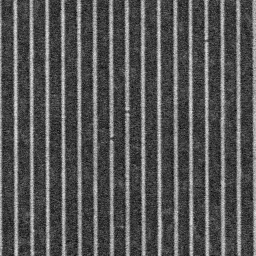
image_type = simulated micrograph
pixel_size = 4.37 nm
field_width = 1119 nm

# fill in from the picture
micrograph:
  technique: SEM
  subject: parallel lines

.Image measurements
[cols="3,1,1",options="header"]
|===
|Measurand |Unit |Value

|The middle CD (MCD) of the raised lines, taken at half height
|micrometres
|0.0115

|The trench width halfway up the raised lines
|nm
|57.4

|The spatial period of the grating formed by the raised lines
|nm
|69.6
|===